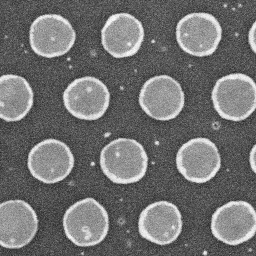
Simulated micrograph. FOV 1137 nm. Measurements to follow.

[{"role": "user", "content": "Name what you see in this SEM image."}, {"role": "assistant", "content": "a regular array of raised bodies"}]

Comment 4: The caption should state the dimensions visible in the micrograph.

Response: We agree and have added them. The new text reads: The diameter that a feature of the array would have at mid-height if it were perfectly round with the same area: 194 nm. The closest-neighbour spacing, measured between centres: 319 nm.